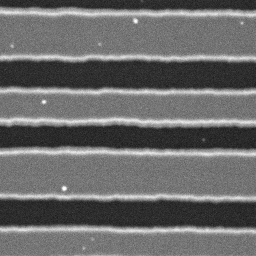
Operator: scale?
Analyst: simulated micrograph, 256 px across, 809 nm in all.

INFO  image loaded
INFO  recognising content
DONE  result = lines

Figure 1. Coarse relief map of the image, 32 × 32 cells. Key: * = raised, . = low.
................................
*****...**......................
********************************
********************************
********************************
********************************
********************************
................................
................................
................................
................................
*********...****.**..*...**....*
********************************
********************************
********************************
................................
................................
................................
................................
********************************
********************************
********************************
********************************
********************************
..******************************
................................
................................
................................
................................
********************************
********************************
********************************